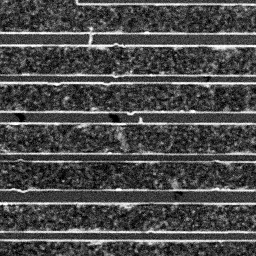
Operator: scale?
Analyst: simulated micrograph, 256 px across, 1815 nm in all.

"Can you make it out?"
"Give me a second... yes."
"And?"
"parallel lines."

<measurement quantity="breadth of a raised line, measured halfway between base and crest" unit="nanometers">209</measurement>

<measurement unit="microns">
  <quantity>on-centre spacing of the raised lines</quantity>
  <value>0.28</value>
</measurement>